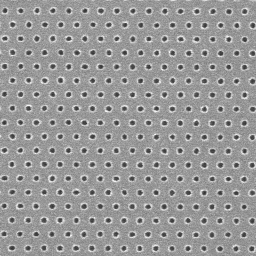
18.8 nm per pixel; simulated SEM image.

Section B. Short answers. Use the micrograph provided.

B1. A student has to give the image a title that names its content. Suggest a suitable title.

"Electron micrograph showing a regular array of holes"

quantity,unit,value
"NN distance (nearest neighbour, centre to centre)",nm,297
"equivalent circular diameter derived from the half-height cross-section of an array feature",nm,104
